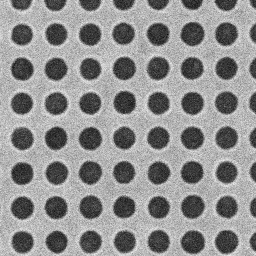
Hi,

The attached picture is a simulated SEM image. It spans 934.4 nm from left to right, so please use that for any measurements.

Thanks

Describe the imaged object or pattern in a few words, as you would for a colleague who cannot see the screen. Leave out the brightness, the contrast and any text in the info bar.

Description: a regular array of holes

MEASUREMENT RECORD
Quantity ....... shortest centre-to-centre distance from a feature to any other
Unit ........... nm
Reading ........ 124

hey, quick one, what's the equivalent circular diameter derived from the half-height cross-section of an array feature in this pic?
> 24.2 pixels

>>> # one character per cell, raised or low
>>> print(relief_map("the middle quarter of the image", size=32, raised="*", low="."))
.***.....***......***......**...
.***......**......**.......**...
.***.....***......***.....***...
*****....****....****....*****..
********************************
********************************
********************************
*****...*****....*****....****..
.***.....***......***.....***...
.***......**......***......**...
.***.....***......***......**...
.***.....****.....***.....****..
*****...******..******...******.
********************************
********************************
**************..*******.*******.
*****....****....****.....****..
.***.....***......***.....***...
.**.......**......**.......**...
.***......**......***.....***...
****.....****....****.....****..
*****...******..*******.*******.
********************************
********************************
*****...******..******...******.
.***.....****.....***.....***...
.***......**......***......**...
.**.......**......***......**...
.***.....****.....***.....***...
*****....****....*****...*****..
********************************
********************************